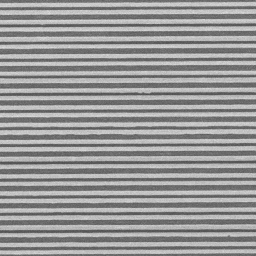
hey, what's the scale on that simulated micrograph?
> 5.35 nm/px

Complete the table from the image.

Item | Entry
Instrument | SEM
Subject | parallel lines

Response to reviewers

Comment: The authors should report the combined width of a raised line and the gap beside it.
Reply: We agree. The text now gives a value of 45.6 nanometers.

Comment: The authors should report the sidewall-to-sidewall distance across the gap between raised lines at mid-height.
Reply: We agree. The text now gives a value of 20.7 nm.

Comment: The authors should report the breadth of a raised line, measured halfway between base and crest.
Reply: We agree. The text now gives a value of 3.87 px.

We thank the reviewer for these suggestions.